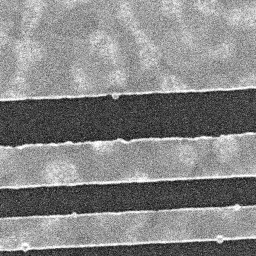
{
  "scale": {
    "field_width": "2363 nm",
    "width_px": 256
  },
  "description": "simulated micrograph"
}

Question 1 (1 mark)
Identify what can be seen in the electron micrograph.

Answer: one or a few lines or trenches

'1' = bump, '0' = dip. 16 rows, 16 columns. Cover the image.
1111111111111111
1111111111111111
1111111111111111
1111111111111111
1111111111111111
1111111111111110
0000000000000000
0000000000000000
0000000000000011
1111111111111111
1111111111111111
1111100000000000
0000000000000000
0000111111111111
1111111111111111
1110000000000000